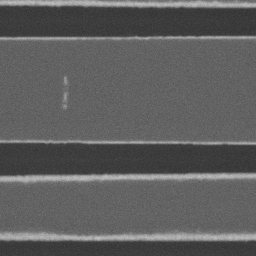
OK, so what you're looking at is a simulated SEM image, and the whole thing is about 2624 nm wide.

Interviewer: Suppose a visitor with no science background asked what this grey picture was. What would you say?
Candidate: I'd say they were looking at lines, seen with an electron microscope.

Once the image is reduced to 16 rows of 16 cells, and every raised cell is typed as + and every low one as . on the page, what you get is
................
................
++++++++++++++++
++++++++++++++++
++++++++++++++++
++++++++++++++++
++++++++++++++++
++++++++++++++++
++++++++++++++++
................
................
++++++++++++++++
++++++++++++++++
++++++++++++++++
++++++++++++++++
................